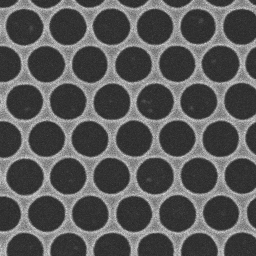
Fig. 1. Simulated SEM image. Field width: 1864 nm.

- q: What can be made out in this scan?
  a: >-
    a regular array of holes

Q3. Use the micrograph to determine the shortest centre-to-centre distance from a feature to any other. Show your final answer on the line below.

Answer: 313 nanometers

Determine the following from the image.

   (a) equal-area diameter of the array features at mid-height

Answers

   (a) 268 nanometres